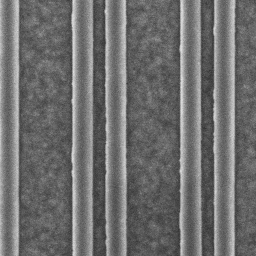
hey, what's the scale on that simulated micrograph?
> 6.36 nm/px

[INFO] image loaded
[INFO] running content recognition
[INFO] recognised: lines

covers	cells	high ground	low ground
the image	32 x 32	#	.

##.......##..###.......##..##...
##.......##..###.......##..##...
##.......##..###.......##..##...
##.......##..###.......##..##...
##.......##..###.......##..##...
##.......##..###.......##..##...
##.......##..###.......##..##...
##.......##..###.......##..##...
##.......##..###.......##..##...
##.......##..###.......##..##...
##.......##..###.......##..##...
##.......##..###.......##..##...
##.......##..###.......##..##...
##.......##..###.......##..##...
##.......##..###.......##..##...
##.......##..###.......##..##...
##.......##..###.......##..##...
##.......##..###.......##..##...
##.......##..###.......##..##...
##.......##..###.......##..##...
##.......##..###.......##..##...
##.......##..###.......##..##...
##.......##..###.......##..##...
##.......##..###.......##..##...
##.......##..###.......##..##...
##.......##..###.......##..##...
##.......##..###.......##..##...
##.......##..###.......##..##...
##.......##..###.......##..##...
##.......##..###.......##..##...
##.......##..###.......##..##...
##.......##..###.......##..##...